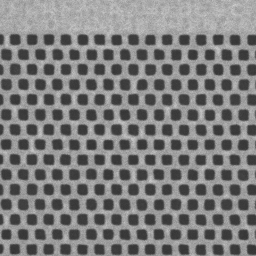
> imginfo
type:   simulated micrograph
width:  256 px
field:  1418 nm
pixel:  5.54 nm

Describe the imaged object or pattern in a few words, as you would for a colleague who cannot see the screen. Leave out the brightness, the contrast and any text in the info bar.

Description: a regular array of holes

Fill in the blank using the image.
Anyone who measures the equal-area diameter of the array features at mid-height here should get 11.7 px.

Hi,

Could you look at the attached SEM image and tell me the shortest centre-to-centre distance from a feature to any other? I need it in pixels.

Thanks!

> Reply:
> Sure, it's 16.8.